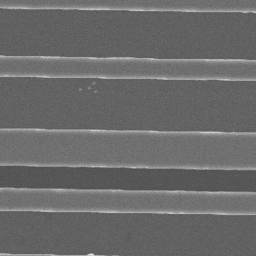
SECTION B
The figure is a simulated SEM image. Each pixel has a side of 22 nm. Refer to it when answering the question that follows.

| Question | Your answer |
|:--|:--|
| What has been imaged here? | lines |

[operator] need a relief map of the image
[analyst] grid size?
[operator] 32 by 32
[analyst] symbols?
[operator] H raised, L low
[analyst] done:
HHHHHHHHHHHHHHHHHHHHHHHHHHHHHHHH
LLLLLLLLLLLLLLLLLLLLLLLLLLLLLLLH
LLLLLLLLLLLLLLLLLLLLLLLLLLLLLLLL
LLLLLLLLLLLLLLLLLLLLLLLLLLLLLLLL
LLLLLLLLLLLLLLLLLLLLLLLLLLLLLLLL
LLLLLLLLLLLLLLLLLLLLLLLLLLLLLLLL
LLLLLLLLLLLLLLLLLLLLLLLLLLLLLLLL
HHHHHHHHHHHHHHHHHHHHHHHHHHHLLLLL
HHHHHHHHHHHHHHHHHHHHHHHHHHHHHHHH
HHHHHHHHHHHHHHHHHHHHHHHHHHHHHHHH
LLLLLLLLLLLLLLLLLLLLLLLLLLLLLLLL
LLLLLLLLLLLLLLLLLLLLLLLLLLLLLLLL
LLLLLLLLLLLLLLLLLLLLLLLLLLLLLLLL
LLLLLLLLLLLLLLLLLLLLLLLLLLLLLLLL
LLLLLLLLLLLLLLLLLLLLLLLLLLLLLLLL
LLLLLLLLLLLLLLLLLLLLLLLLLLLLLLLL
HHHHHHHHHHHHHHHHHHHLLLLLLLLLLLLL
HHHHHHHHHHHHHHHHHHHHHHHHHHHHHHHH
HHHHHHHHHHHHHHHHHHHHHHHHHHHHHHHH
HHHHHHHHHHHHHHHHHHHHHHHHHHHHHHHH
HHHHHHHHHHHHHHHHHHHHHHHHHHHHHHHH
LLLLLLLLLLLLLLLLLLLLLLLLLLLLLLLL
LLLLLLLLLLLLLLLLLLLLLLLLLLLLLLLL
LLLLLLLLLLLLLLLLLLLLLLLLLLLLLLLL
HHHHHHHHHHHHHHHHHHHHHHHHHHHHHHHH
HHHHHHHHHHHHHHHHHHHHHHHHHHHHHHHH
LLLLLLLLLLLLLHHHHHHHHHHHHHHHHHHH
LLLLLLLLLLLLLLLLLLLLLLLLLLLLLLLL
LLLLLLLLLLLLLLLLLLLLLLLLLLLLLLLL
LLLLLLLLLLLLLLLLLLLLLLLLLLLLLLLL
LLLLLLLLLLLLLLLLLLLLLLLLLLLLLLLL
LLLLLLLLLLLLLLLLLLLLLLLLLLLLLLLL